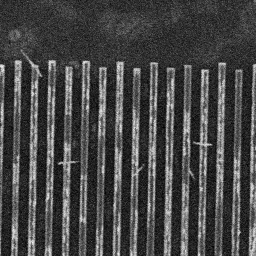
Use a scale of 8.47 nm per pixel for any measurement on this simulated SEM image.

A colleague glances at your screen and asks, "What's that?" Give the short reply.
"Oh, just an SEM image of parallel lines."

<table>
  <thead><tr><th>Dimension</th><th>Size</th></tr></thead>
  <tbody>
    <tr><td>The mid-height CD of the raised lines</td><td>0.0593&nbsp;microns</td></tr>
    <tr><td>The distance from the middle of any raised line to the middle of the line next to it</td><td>144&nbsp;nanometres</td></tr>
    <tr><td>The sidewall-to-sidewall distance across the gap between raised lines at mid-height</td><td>88.9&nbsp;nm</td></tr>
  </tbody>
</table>